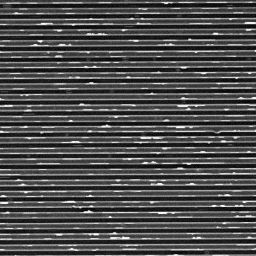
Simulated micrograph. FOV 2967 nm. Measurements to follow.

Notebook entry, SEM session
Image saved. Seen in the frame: parallel lines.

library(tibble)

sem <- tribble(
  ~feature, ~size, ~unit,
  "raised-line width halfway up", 66.6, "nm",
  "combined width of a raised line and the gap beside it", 124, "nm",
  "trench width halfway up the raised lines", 0.0565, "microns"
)